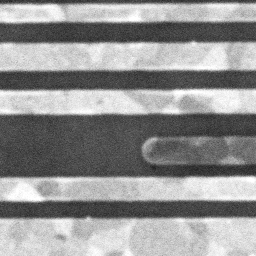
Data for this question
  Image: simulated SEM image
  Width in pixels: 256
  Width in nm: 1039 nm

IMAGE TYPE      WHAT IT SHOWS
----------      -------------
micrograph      groups of lines, slits or small figures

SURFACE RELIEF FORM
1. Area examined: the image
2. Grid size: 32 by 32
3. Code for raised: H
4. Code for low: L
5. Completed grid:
LLLLLLLLLLLLLLLLLLLLLLLLLLLLLLLL
HHHHHHHHHHHHHHHHHHHHHHHHHHHHHHHH
HHHHHHHHHHHHHHHHHHHHHHHHHHHHHHLL
LLLLLLLLLLLLLLLLLLLLLLLLLLLLLLLL
LLLLLLLLLLLLLLLLLLLLLLLLLLLLLLLL
LLLLLLLLLLLLLLLLLLLLLLLHHLLHHHHH
HHHHHHHHHHHHHHHHHHHHHHHHHHHHHHHH
HHHHHHHHHHHHHHHHHHHHHHHHHHHHHHHH
HHHHHHHHHHHHHHHHHHHHLLLLHHHHHHHH
LLLLLLLLLLLLLLLLLLLLLLLLLLLLLLLL
LLLLLLLLLLLLLLLLLLLLLLLLLLLLLLLL
LLLLLLLLHHHHHHHHHHLLLLLLHHHHHHHH
HHHHHHHHHHHHHHHHHHHHHHHHHHHHHHHH
HHHHHHHHHHHHHHHHHHHHHHHHHHHHHHHH
LLLLLLLLLLLLLLLLLLLLLLLLLLLLLLLL
LLLLLLLLLLLLLLLLLLLLLLLLLLLLLLLL
LLLLLLLLLLLLLLLLLLLLLLLLLLLLLLLL
LLLLLLLLLLLLLLLLLLLHHHHHHHHHHHHH
LLLLLLLLLLLLLLLLLLHHHHHHHHHHHHHH
LLLLLLLLLLLLLLLLLLHHHHHHHHHHHHHH
LLLLLLLLLLLLLLLLLLLLLLLLLLLLLLLL
LLLLLLLLLLLLLLLLLLLLLLLLLLLLLLLL
HHHHHHHHLHHHHHHHHHHHHHHHHHHHHHHH
HHHHHHHHHHHHHHHHHHHHHHHHHHHHHHHH
HHHHHHHHHHHHHHHHHHHHHHHHHHHHHHHH
LLLLLLLLLLLLLLLLLLLLLLLLLLLLLLLL
LLLLLLLLLLLLLLLLLLLLLLLLLLLLLLLL
LHHHLLLLHHHHHHHHHHHHHHLLLLLHHHHH
HHHHHHHHHHHHHHHHHHHHHHHHHHHHHHHH
HHHHHHHHHHHHHHHHHHHHHHHHHHHHHHHH
HHHHHHHHHHHHHHHHHHHHHHHHHHHHHHHH
HHHHHHHHHHHHHHHHHHHHHHHHHHHHHHHH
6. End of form